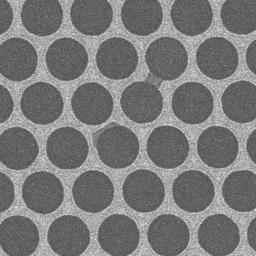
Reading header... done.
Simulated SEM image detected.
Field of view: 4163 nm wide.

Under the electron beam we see a regular array of holes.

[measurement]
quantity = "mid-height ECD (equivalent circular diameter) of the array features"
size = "701 nm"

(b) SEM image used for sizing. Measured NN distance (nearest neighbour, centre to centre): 814 nanometres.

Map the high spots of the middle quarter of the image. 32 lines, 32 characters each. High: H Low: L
LLLLLLHHLLLLLLLLLLHHHLLLLLLLLLLH
LLLLLHHHHLLLLLLLLLHHHLLLLLLLLLHH
LLLLHHHHHHLLLLLLLHHHHLLLLLLLLLHH
LLLLHHHHHHHLLLLLHHHHLLLLLLLLHHHH
HHHHHHLLHHHHHHHHHHLLLLLLLHHHHHHL
HHHHLLLLLLHHHHHHLLLLLLLLHHHHHLLL
HHHLLLLLLLLHHHHLLLLLLLLLHHHHLLLL
HHLLLLLLLLLLHHLLLLLLLLLLHHHLLLLL
HHLLLLLLLLLLHHLLLLLLLLLLLHHLLLLL
HHLLLLLLLLLLLHLLLLLLLLLLLHHLLLLL
HHLLLLLLLLLLLHLLLLLLLLLLLHHLLLLL
HHLLLLLLLLLLHHHLLLLLLLLLLHHLLLLL
HHHLLLLLLLLLHHHLLLLLLLLLHHHLLLLL
HHHLLLLLLLLHHHHHLLLLLLLHHHHHLLLL
HHHHLLLLLLHHHHHHHLLLLLHHHHHHHHLL
HHHHHHHLHHHHLLLHHHHHHHHHLLLHHHHH
LLLLHHHHHHLLLLLLLHHHHHLLLLLLLHHH
LLLLLHHHHLLLLLLLLLHHHLLLLLLLLLHH
LLLLLHHHHLLLLLLLLLLHHLLLLLLLLLLH
LLLLLLHHLLLLLLLLLLLHHLLLLLLLLLLH
LLLLLLHHLLLLLLLLLLLHHLLLLLLLLLLH
LLLLLLHHLLLLLLLLLLLHHLLLLLLLLLLH
LLLLLLHHLLLLLLLLLLLHHLLLLLLLLLLH
LLLLLLHHHLLLLLLLLLHHHLLLLLLLLLLH
LLLLLHHHHHLLLLLLLLHHHHLLLLLLLLHH
LLLLHHHHHHHLLLLLHHHHHHHLLLLLLHHH
HHHHHHLLHHHHHHHHHHLLLHHHHHHHHHHL
HHHHLLLLLLHHHHHHLLLLLLLHHHHHHLLL
HHHLLLLLLLLLHHHLLLLLLLLLHHHHLLLL
HHLLLLLLLLLLHHHLLLLLLLLLLHHLLLLL
HHLLLLLLLLLLHHHLLLLLLLLLLHHLLLLL
HHLLLLLLLLLLLHLLLLLLLLLLLHHLLLLL